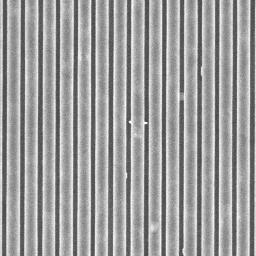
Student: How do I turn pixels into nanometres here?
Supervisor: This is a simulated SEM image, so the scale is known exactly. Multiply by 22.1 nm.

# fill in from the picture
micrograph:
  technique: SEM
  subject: parallel lines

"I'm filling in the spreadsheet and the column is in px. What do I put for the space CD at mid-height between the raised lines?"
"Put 5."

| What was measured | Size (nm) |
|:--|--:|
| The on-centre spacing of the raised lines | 391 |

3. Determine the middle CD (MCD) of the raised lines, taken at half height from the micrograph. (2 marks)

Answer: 0.287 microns